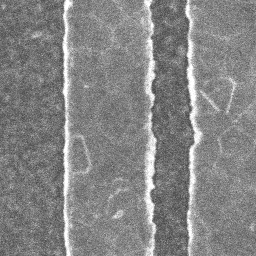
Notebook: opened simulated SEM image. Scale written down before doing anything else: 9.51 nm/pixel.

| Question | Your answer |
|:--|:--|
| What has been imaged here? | one or a few lines or trenches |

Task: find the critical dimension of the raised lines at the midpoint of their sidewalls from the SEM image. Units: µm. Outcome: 0.82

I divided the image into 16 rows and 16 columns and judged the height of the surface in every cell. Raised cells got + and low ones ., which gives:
....+++++...++++
....+++++...++++
....+++++...++++
....++++++..++++
....+++++...++++
....+++++...++++
....++++++..++++
....+++++...++++
....++++++..++++
....++++++..++++
....++++++..++++
....+++++...++++
....+++++...++++
....+++++...++++
....++++++..++++
....++++++..++++